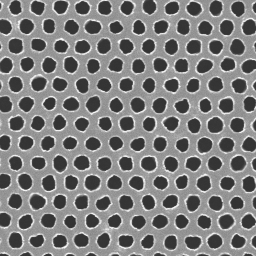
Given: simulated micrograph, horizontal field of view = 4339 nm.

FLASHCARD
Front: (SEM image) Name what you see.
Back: a regular array of holes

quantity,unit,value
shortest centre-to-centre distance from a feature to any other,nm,364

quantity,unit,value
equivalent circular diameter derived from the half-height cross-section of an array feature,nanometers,234